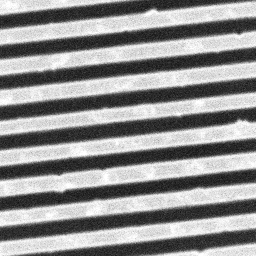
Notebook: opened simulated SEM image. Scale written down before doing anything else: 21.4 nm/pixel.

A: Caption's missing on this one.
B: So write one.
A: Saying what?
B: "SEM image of parallel lines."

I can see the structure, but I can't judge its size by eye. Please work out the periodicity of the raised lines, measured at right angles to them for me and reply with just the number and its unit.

30.1 px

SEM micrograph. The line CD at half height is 325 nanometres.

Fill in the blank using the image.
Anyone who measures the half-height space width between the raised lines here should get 325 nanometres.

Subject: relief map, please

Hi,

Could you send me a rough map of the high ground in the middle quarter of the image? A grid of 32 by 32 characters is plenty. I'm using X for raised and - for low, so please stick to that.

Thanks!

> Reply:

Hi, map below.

XXX-----------------------------
------------------------------XX
---------------------XXXXXXXXXXX
------------XXXXXXXXXXXXXXXXXXXX
---XXXXXXXXXXXXXXXXXXXXXXXXXXXXX
XXXXXXXXXXXXXXXXXXXXXXXXXXXXX---
XXXXXXXXXXXXXXXXXX--------------
XXXXXXXXX-----------------------
--------------------------------
-----------------------------XXX
------------------XXXXXXXXXXXXXX
--------XXXXXXXXXXXXXXXXXXXXXXXX
-XXXXXXXXXXXXXXXXXXXXXXXXXXXXX--
XXXXXXXXXXXXXXXXXXXXX-----------
XXXXXXXXXXXX--------------------
XXX-----------------------------
--------------------------------
-----------------------XXXXXXXXX
--------------XXXXXXXXXXXXXXXXXX
-----XXXXXXXXXXXXXXXXXXXXXXXXXXX
XXXXXXXXXXXXXXXXXXXXXXXXXXXX----
XXXXXXXXXXXXXXXXXXX-------------
XXXXXXXXXXX---------------------
--------------------------------
--------------------------XXXXXX
-----------------XXXXXXXXXXXXXXX
--------X-XXXXXXXXXXXXXXXXXXXXXX
-XXXXXXXXXXXXXXXXXXXXXXXXXXXXXXX
XXXXXXXXXXXXXXXXXXXXXXXXXXX-----
XXXXXXXXXXXXXXXXXX--------------
XXXXXXXXX-----------------------
--------------------------------